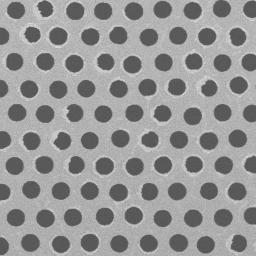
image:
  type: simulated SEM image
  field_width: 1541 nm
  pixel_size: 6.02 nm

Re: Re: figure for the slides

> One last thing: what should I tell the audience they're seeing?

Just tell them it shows a regular array of holes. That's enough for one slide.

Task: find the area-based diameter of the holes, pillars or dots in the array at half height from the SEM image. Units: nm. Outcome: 107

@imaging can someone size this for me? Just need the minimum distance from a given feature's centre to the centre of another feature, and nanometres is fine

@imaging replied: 169